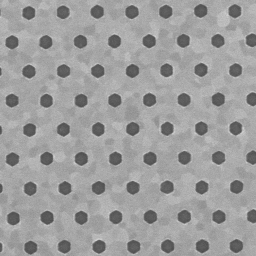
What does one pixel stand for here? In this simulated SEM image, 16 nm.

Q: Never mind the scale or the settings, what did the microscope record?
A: a regular array of holes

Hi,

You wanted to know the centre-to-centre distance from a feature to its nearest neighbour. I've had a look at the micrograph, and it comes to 538 nm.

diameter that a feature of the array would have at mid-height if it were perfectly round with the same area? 220 nm